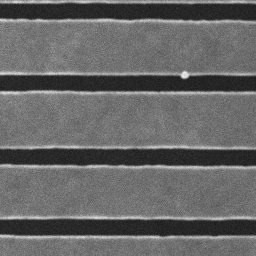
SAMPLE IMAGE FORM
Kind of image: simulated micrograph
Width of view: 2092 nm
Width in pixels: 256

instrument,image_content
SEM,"lines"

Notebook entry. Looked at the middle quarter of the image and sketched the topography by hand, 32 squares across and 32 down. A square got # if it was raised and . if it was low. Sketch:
################################
################################
################################
..............................#.
................................
................................
................................
################################
################################
################################
################################
################################
################################
################################
################################
################################
################################
################################
################################
################################
################################
................................
................................
................................
................................
####..######.##....#######......
################################
################################
################################
################################
################################
################################